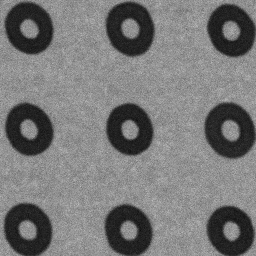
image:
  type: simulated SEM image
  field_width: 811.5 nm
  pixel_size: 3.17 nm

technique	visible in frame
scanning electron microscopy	ring-shaped grooves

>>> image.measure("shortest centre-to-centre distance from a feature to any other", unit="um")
0.319